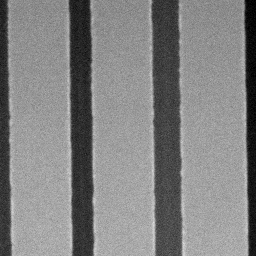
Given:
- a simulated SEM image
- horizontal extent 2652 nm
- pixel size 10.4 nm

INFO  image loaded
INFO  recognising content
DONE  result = lines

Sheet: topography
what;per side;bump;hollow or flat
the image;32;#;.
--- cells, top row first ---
.########..########...#########.
.########..########...########..
.########..########...########..
.########..########...#########.
.########..########....########.
.########..########...#########.
.########...#######...#########.
.########...#######....########.
.########..########...#########.
.########..########....########.
.########..########....########.
.########..########....########.
.########...#######....########.
.########...#######....########.
.########...#######....########.
.########...#######....########.
.########...#######....########.
.########...#######....########.
.########...#######....########.
.########...#######....########.
.########...#######....########.
.########...#######....########.
.########...#######....########.
.########...#######....########.
.########...#######....########.
.########...#######....########.
.########...#######....########.
.########...#######....########.
.########...#######....########.
.########...#######....########.
.########...#######....########.
..#######...#######....########.